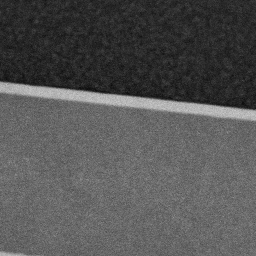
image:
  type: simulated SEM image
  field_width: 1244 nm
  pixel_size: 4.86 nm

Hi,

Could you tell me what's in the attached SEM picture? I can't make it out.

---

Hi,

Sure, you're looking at one or a few lines or trenches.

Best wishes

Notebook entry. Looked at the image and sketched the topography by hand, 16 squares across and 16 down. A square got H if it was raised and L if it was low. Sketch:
LLLLLLLLLLLLLLLL
LLLLLLLLLLLLLLLL
LLLLLLLLLLLLLLLL
LLLLLLLLLLLLLLLL
LLLLLLLLLLLLLLLL
HLLLLLLLLLLLLLLL
HHHHHHHHHHLLLLLL
HHHHHHHHHHHHHHHH
HHHHHHHHHHHHHHHH
HHHHHHHHHHHHHHHH
HHHHHHHHHHHHHHHH
HHHHHHHHHHHHHHHH
HHHHHHHHHHHHHHHH
HHHHHHHHHHHHHHHH
HHHHHHHHHHHHHHHH
HHHHHHHHHHHHHHHH